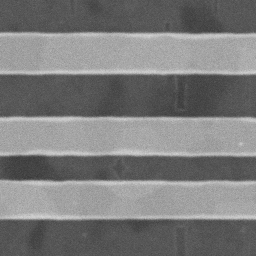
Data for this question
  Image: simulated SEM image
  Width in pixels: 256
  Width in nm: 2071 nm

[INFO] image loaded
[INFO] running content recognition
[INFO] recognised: wiring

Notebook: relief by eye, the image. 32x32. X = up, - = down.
--------------------------------
--------------------------------
--------------------------------
--------------------------------
XXXXXXXXXXXXXXXXXXXXXXXX-XXXXXXX
XXXXXXXXXXXXXXXXXXXXXXXXXXXXXXXX
XXXXXXXXXXXXXXXXXXXXXXXXXXXXXXXX
XXXXXXXXXXXXXXXXXXXXXXXXXXXXXXXX
XXXXXXXXXXXXXXXXXXXXXXXXXXXXXXXX
--------------------------------
--------------------------------
--------------------------------
--------------------------------
--------------------------------
--------------------------------
XXXXXXXXXXXXXXXXXXXXXXXXXXXXXXXX
XXXXXXXXXXXXXXXXXXXXXXXXXXXXXXXX
XXXXXXXXXXXXXXXXXXXXXXXXXXXXXXXX
XXXXXXXXXXXXXXXXXXXXXXXXXXXXXXXX
--------------------------------
--------------------------------
--------------------------------
--------------------------------
XXXXXXXXXXXXXXXXXXXXXXXXXXXXXXXX
XXXXXXXXXXXXXXXXXXXXXXXXXXXXXXXX
XXXXXXXXXXXXXXXXXXXXXXXXXXXXXXXX
XXXXXXXXXXXXXXXXXXXXXXXXXXXXXXXX
--------------------------------
--------------------------------
--------------------------------
--------------------------------
--------------------------------